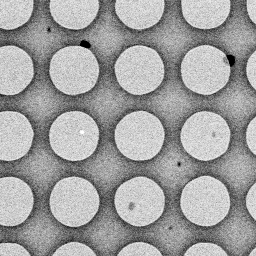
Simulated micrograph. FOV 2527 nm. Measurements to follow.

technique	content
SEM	an array of small figures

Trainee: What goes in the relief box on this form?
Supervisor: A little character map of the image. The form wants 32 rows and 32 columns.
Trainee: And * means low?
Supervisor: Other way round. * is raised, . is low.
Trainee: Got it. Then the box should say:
****..******..******...******..*
****..******...*****...******..*
***....*****...*****...*****....
**.......*.......*.......*......
................................
................................
***....****....****.....****....
****..******...*****...*****...*
****..******..******...******..*
****..******...*****...******..*
****...*****...*****...*****...*
**......***.....***.....***.....
................................
................................
***.....***.....***.....***.....
****...*****...*****...*****...*
****..******..******...******..*
****..******..******...******..*
****...*****...*****...*****...*
***.....***.....***.....***.....
................................
................................
***.....***.....***.....***.....
****...*****...*****...*****...*
****..******..******...******..*
****..******..******...******..*
****...*****...*****...*****...*
***....****.....***.....****....
................................
................................
........**......**.......*......
***....*****...*****...*****...*